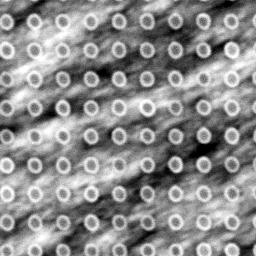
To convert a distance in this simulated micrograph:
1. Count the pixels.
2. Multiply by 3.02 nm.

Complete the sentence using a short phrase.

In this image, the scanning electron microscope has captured a regular array of raised bodies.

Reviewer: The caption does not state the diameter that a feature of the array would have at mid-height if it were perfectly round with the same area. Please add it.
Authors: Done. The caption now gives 13.4 px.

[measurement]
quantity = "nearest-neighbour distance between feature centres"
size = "84.7 nanometers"